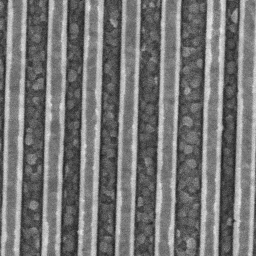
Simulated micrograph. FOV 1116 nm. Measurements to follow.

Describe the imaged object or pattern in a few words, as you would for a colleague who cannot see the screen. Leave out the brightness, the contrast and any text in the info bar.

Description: parallel lines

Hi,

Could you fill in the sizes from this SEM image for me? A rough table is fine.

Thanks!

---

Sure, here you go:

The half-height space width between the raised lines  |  98.9 nm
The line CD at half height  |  67.6 nm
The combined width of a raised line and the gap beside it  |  171 nm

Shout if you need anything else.